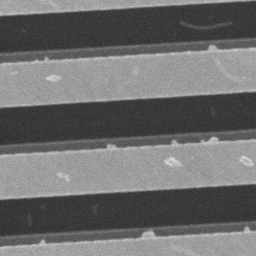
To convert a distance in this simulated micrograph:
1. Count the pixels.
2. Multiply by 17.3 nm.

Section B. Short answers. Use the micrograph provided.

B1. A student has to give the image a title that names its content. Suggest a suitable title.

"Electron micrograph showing lines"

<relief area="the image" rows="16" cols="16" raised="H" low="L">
HHHHHHHHLLLLLLLL
LLLLLLLLLLLLLLLL
LLLLLLLLLLLLLLLH
HHHHHHHHHHHHHHHH
HHHHHHHHHHHHHHHH
HHHHHHHHHHHHHHHH
HHHLLLLLLLLLLLLL
LLLLLLLLLLLLLLLL
LLLLLLLLLLLHHHHH
HHHHHHHHHHHHHHHH
HHHHHHHHHHHHHHHH
HHHHHHHHHHHHHHHH
LLLLLLLLLLLLLLLL
LLLLLLLLLLLLLLLL
LLLLLLHHHHHHHHHH
HHHHHHHHHHHHHHHH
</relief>